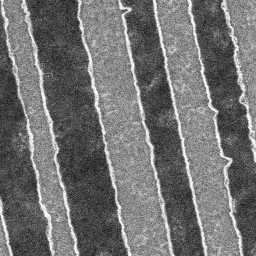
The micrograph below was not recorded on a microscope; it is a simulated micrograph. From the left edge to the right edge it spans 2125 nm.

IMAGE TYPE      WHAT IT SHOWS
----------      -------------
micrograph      one or a few lines or trenches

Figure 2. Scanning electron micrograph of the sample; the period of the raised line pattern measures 652 nanometers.